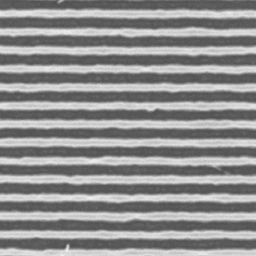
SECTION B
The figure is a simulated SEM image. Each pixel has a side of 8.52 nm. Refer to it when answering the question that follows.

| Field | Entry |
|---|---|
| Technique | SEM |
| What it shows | parallel lines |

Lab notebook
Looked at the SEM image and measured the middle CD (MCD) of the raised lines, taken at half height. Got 62.9 nanometers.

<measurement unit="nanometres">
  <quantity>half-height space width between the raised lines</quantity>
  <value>93.8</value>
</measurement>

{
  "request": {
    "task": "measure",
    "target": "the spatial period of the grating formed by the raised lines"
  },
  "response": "157 nanometres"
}